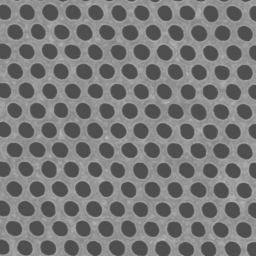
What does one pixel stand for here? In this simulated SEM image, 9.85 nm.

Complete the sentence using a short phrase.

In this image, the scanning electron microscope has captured a regular array of holes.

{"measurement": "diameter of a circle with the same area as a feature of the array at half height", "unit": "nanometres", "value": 152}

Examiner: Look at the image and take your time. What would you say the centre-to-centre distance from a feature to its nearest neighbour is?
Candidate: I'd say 220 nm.